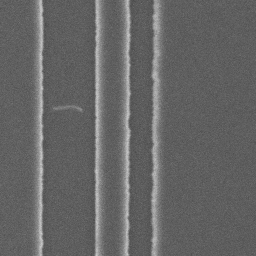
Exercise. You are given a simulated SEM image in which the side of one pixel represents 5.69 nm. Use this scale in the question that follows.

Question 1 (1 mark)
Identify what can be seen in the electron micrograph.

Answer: lines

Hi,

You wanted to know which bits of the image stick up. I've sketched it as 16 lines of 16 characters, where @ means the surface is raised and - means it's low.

@@@---@@--@@@@@@
@@@---@@--@@@@@@
@@@---@@--@@@@@@
@@@---@@--@@@@@@
@@@---@@--@@@@@@
@@@---@@--@@@@@@
@@@---@@--@@@@@@
@@@---@@--@@@@@@
@@@---@@--@@@@@@
@@@---@@--@@@@@@
@@@---@@--@@@@@@
@@@---@@--@@@@@@
@@@---@@--@@@@@@
@@@---@@--@@@@@@
@@@---@@--@@@@@@
@@@---@@--@@@@@@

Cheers